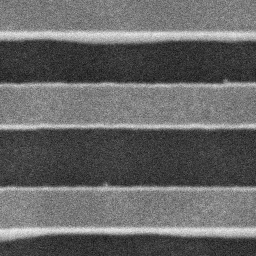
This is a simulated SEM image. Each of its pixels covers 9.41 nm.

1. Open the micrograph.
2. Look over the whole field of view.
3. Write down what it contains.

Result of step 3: lines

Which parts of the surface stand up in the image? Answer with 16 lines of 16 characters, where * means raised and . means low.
****************
****************
................
................
................
****************
****************
****************
................
................
................
................
****************
****************
**..............
................